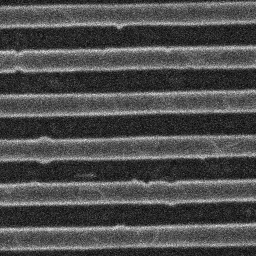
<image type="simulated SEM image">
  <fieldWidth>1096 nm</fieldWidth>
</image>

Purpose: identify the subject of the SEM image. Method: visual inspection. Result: parallel lines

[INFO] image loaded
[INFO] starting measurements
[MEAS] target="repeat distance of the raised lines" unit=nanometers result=190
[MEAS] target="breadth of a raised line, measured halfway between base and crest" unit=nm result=85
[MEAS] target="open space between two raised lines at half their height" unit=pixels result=24.2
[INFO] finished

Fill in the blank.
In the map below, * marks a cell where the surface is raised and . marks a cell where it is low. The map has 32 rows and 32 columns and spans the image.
........................********
********************************
********************************
................................
................................
................................
**.*****************************
********************************
*****************.....*.........
................................
................................
........................***...**
********************************
********************************
.**.............................
................................
................................
....***...**********************
********************************
*****************************...
................................
................................
................................
********************************
********************************
***.............................
................................
................................
..............******************
********************************
********************************
................................